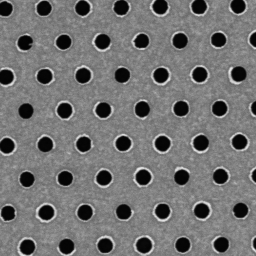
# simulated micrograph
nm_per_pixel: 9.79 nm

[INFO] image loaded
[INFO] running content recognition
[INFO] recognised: a regular array of holes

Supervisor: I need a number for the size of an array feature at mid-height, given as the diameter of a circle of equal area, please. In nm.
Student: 151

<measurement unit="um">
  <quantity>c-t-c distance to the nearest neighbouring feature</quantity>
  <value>0.379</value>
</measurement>